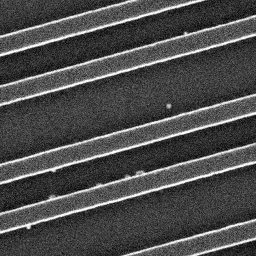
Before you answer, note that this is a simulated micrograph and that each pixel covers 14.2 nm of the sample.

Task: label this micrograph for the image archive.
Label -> lines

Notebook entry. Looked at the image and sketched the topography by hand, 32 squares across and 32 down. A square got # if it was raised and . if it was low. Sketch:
...............#########........
...........#########............
.......#########..............##
....#########..............#####
#########..............#########
#####..............#########....
##.............#########........
............#########...........
........#########...............
.....#########..................
.#########......................
######..........................
##...........................###
..........................######
......................#########.
...................########.....
...............#########........
...........#########............
........########..............##
....#########.............######
#########.............#########.
######.............#########....
##.............#########........
............#########...........
........#########...............
....#########...................
.########.......................
######..........................
##..........................####
.........................#######
.....................#########..
.................#########......